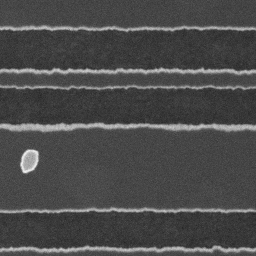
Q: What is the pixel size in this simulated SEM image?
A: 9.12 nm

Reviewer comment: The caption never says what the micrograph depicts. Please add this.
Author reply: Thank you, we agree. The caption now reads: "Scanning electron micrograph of lines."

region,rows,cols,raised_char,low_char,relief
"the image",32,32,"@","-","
@@@@@@@@@@@@@@@@@@@@@@@@@@@@@@@@
@@@@@@@@@@@@@@@@@@@@@@@@@@@@@@@@
@@@@@@@@@@@@@@@@@@@@@@@@@@@@@@@@
@@@@@@@@@@@@@@@@@@@@@@@@@@@@@@@@
--------------------------------
--------------------------------
--------------------------------
--------------------------------
--------------------------------
@@@@@@@@@@@@@@@@@@@@@@@@@@@@@@@@
@@@@@@@@@@@@@@@@@@@@@@@@@@@@@@@@
--------------------------------
--------------------------------
--------------------------------
--------------------------------
--------------------------------
@@@@@@@@@@@@@@@@@@@@@@@@@@@@@@@@
@@@@@@@@@@@@@@@@@@@@@@@@@@@@@@@@
@@@@@@@@@@@@@@@@@@@@@@@@@@@@@@@@
@@@@@@@@@@@@@@@@@@@@@@@@@@@@@@@@
@@@@@@@@@@@@@@@@@@@@@@@@@@@@@@@@
@@@@@@@@@@@@@@@@@@@@@@@@@@@@@@@@
@@@@@@@@@@@@@@@@@@@@@@@@@@@@@@@@
@@@@@@@@@@@@@@@@@@@@@@@@@@@@@@@@
@@@@@@@@@@@@@@@@@@@@@@@@@@@@@@@@
@@@@@@@@@@@@@@@@@@@@@@@@@@@@@@@@
@@@--@@@------------@@------@---
--------------------------------
--------------------------------
--------------------------------
--------------------------------
@@@@@@@@@@@@@@@@@@@@@@@@@@@@@@@@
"